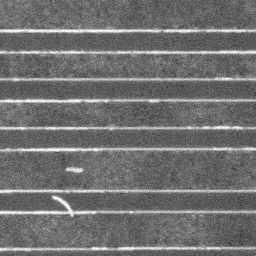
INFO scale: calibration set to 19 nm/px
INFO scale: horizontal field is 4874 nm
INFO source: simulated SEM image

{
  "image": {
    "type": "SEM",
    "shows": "lines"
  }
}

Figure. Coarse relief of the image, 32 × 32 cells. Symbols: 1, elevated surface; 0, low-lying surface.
00000000000000000000000000000000
00000000000000000000000000000000
00000000000000000000000000000000
00000000000000000000000000000000
11111111111111111111111111111111
11111111111111111111111111111111
11111111111111111111111111111111
00000000000000000000000000000000
00000000000000000000000000000000
00000000000000000000000000000000
11111111111111111111111111111111
11111111111111111111111111111111
11111111111111111111111111111111
00000000000000000000000000000000
00000000000000000000000000000000
00000000000000000000000000000000
11111111111111111111111111111111
11111111111111111111111111111111
11111111111111111111111111111111
00000000000000000000000000000000
00000000000000000000000000000000
00000000000000000000000000000000
00000000000000000000000000000000
00000000000000000000000000000000
11111111111111111111111111111111
11111111111111111111111111111111
11111111111000000000000000000000
00000000000000000000000000000000
00000000000000000000000000000000
00000000000000000000000000000000
00000000000000000000000000000000
11111111111111111111111111111111